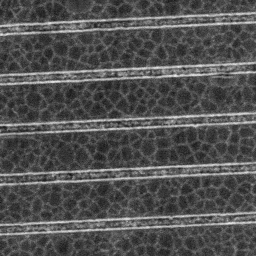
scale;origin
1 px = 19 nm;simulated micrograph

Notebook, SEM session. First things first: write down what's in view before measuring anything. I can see parallel lines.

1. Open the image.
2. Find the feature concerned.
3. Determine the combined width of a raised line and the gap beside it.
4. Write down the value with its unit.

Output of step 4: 950 nanometres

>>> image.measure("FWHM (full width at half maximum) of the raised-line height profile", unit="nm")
169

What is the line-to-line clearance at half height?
775 nm